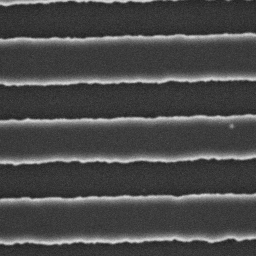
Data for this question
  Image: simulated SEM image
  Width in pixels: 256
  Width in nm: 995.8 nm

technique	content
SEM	lines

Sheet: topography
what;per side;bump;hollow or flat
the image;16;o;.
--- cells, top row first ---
................
................
oooooooooooooooo
oooooooooooooooo
oooooooooooooooo
................
................
.....ooooooooooo
oooooooooooooooo
oooooooooooooooo
................
................
oooooooooooooooo
oooooooooooooooo
oooooooooooooooo
................